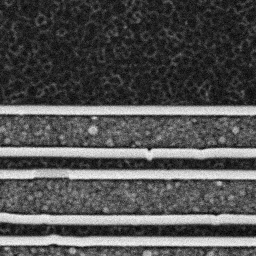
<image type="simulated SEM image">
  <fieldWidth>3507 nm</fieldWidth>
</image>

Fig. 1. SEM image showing one or a few lines or trenches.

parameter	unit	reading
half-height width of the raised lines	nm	298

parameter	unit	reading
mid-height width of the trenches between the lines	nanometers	599